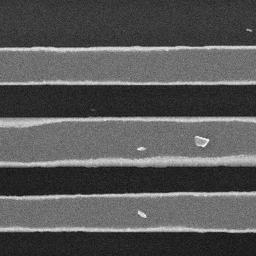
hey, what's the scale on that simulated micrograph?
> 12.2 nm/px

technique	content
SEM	lines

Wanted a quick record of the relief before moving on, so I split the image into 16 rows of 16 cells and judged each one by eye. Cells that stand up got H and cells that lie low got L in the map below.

LLLLLLLLLLLLLLLL
LLLLLLLLLLLLLLLL
LLLLLLLLLLLLLLLL
HHHHHHHHHHHHHHHH
HHHHHHHHHHHHHHHH
LLLLLLLLLLLLLLLL
LLLLLLLLLLLLLLLL
HHHHHHHHHHHHHHHH
HHHHHHHHHHHHHHHH
HHHHHHHHHHHHHHHH
LLLLLLLLLLLLLLLL
LLLLLLLLLLLLLLLL
HHHHHHHHHHHHHHHH
HHHHHHHHHHHHHHHH
LLLLLLLLLLLLLLHH
LLLLLLLLLLLLLLLL